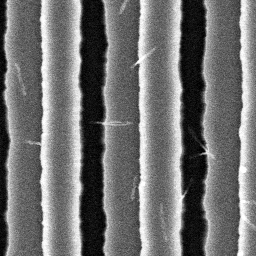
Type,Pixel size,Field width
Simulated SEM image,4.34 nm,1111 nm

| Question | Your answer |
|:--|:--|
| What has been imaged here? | lines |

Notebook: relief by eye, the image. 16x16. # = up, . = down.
#####..####..###
#####..####..###
#####..####..###
#####..####..###
#####..####..###
#####..####..###
#####..####..###
.####..####..###
.####..####..###
.####..####..###
.####.#####..###
.####..####..###
.####..####..###
#####..####..###
.####..####..###
.####..####..###